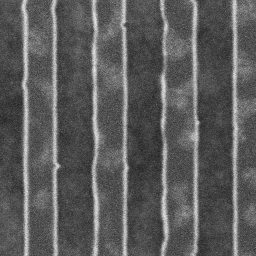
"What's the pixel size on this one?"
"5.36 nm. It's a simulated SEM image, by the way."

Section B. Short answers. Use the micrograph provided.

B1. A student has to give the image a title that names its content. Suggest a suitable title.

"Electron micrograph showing one or a few lines or trenches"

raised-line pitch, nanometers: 374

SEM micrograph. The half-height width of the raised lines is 161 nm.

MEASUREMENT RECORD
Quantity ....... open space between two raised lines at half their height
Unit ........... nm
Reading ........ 209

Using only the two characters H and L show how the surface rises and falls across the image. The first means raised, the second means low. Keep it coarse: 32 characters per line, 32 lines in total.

LLLHHHHLLLLLHHHHLLLLHHHHLLLLLHHH
LLLHHHHLLLLLHHHLLLLLHHHHLLLLLHHH
LLLHHHHLLLLLHHHHLLLLLHHHLLLLLHHH
LLLHHHHLLLLLHHHLLLLLLHHHLLLLLHHH
LLLHHHHLLLLLHHHHLLLLLHHHLLLLLHHH
LLLHHHHLLLLLHHHHLLLLHHHHLLLLLHHH
LLLHHHHLLLLLHHHHLLLLLHHHLLLLLHHH
LLLHHHHLLLLLHHHHLLLLLHHHLLLLLHHH
LLLHHHHLLLLLHHHHLLLLLHHHLLLLLHHH
LLLHHHHLLLLLHHHHLLLLHHHHLLLLLHHH
LLLHHHHLLLLLHHHHLLLLHHHHLLLLLHHH
LLLHHHHLLLLLHHHHLLLLHHHHLLLLLHHH
LLLHHHHLLLLLHHHHLLLLHHHHLLLLLHHH
LLLHHHHLLLLLHHHHLLLLHHHHLLLLLHHH
LLLHHHHLLLLLHHHHLLLLHHHHLLLLLHHH
LLLHHHHLLLLLHHHHLLLLHHHHHLLLLHHH
LLLHHHHLLLLLHHHHLLLLHHHHHLLLLHHH
LLLHHHHLLLLLHHHHLLLLHHHHHLLLLHHH
LLLHHHHLLLLLHHHHLLLLLHHHLLLLLHHH
LLLHHHHLLLLLHHHHLLLLLHHHLLLLLHHH
LLLHHHHLLLLLHHHHLLLLLHHHLLLLLHHH
LLLHHHHLLLLLHHHHLLLLHHHHLLLLLHHH
LLLHHHHLLLLLHHHHLLLLHHHHLLLLLHHH
LLLHHHHLLLLLHHHHLLLLLHHHLLLLLHHH
LLLHHHHLLLLLHHHHLLLLHHHHLLLLLHHH
LLLHHHHLLLLLHHHHLLLLHHHHLLLLLHHH
LLLHHHHLLLLLHHHHLLLLHHHHHLLLLHHH
LLLHHHHLLLLLHHHHLLLLLHHHLLLLLHHH
LLLHHHHLLLLLHHHHLLLLLHHHLLLLLHHH
LLLHHHHLLLLLHHHHLLLLLHHHHLLLLHHH
LLLHHHHLLLLLHHHHLLLLLHHHHLLLLHHH
LLLHHHHLLLLLHHHHLLLLHHHHLLLLLHHH